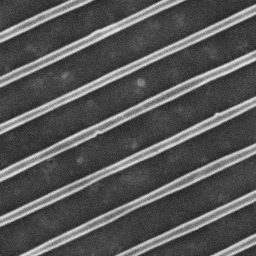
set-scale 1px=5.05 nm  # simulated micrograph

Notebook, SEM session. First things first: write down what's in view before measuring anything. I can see parallel lines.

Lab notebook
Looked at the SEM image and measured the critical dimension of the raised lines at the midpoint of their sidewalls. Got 37.1 nanometers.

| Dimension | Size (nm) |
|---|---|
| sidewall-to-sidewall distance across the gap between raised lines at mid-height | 174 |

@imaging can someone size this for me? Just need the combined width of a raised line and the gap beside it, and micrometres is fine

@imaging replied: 0.212